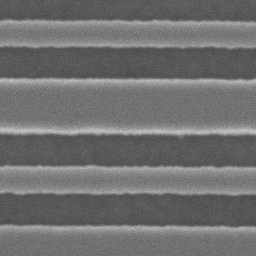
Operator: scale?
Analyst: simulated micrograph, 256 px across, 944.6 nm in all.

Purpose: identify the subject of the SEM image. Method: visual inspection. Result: lines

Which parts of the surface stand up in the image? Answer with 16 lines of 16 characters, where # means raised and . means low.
................
################
################
................
................
################
################
################
................
................
################
################
................
................
################
################